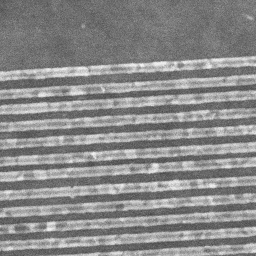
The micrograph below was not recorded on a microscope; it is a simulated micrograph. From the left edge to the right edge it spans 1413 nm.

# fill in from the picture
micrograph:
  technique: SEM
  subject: parallel lines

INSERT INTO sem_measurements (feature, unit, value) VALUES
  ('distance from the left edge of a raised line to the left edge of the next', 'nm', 93.7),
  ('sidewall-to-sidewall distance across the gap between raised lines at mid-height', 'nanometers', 57.1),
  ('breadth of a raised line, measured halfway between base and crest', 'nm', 36.5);